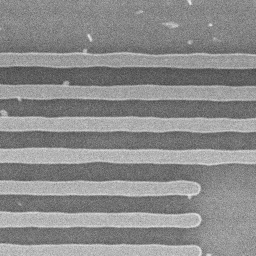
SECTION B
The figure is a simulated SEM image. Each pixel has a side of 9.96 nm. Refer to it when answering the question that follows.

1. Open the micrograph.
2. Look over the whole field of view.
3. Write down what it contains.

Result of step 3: groups of lines, slits or small figures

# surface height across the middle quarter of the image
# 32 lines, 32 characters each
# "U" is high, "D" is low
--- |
UUUUUUUUDDUUUUUUUUUUUUUUUUUUUUUU
DDDDDDDDDDDDDDDDDDDDDDDDDDDDDDDD
DDDDDDDDDDDDDDDDDDDDDDDDDDDDDDDD
DDDDDDDDDDDDDDDDDDDDDDDDDDDDDDDD
DDDDDDDDDDDDDDDDDDDDDDDDDDDDDDDD
UDDDDDDDDDDDDDDDDDUUUUUUDDDDDDDD
UUUUUUUUUUUUUUUUUUUUUUUUUUUUUUUU
UUUUUUUUUUUUUUUUUUUUUUUUUUUUUUUU
DDDDUUUUUUUUUUUUUUUUUUUUUUUUUUUU
DDDDDDDDDDDDDDDDDDDDDDDDDDDDDDDD
DDDDDDDDDDDDDDDDDDDDDDDDDDDDDDDD
DDDDDDDDDDDDDDDDDDDDDDDDDDDDDDDD
DDDDDDDDDDDDDDDDDDDDDDDDDDDDDDDD
UUUUUUUUUUUUUUUUUUUUUUUUDDDDDDDD
UUUUUUUUUUUUUUUUUUUUUUUUUUUUUUUU
UUUUUUUUUUUUUUUUUUUUUUUUUUUUUUUU
UUUUUUUUUUUUUUUUUUUUUUUUUUUUUUUU
DDDDDDDDDDDDDDDDDDDDDDDDDDDDDDDD
DDDDDDDDDDDDDDDDDDDDDDDDDDDDDDDD
DDDDDDDDDDDDDDDDDDDDDDDDDDDDDDDD
DDDDDDDDDDDDDDDDDDDDDDDDDDDDDDDD
UUDDUDDDDDDDDDDDDDDDDDDDDDDDDDDD
UUUUUUUUUUUUUUUUUUUUUUUUUUUUUUUU
UUUUUUUUUUUUUUUUUUUUUUUUUUUUUUUU
UUUUUDDDDDDDDUUUUUUUDUUUUUUUUUUU
DDDDDDDDDDDDDDDDDDDDDDDDDDDDDDDD
DDDDDDDDDDDDDDDDDDDDDDDDDDDDDDDD
DDDDDDDDDDDDDDDDDDDDDDDDDDDDDDDD
DDDDDDDDDDDDDDDDDDDDDDDDDDDDDDDD
DDUUUUDDDDDUUUUUDDDDDDDDDDDUUUUD
UUUUUUUUUUUUUUUUUUUUUUUUUUUUUUUU
UUUUUUUUUUUUUUUUUUUUUUUUUUUUUUUU